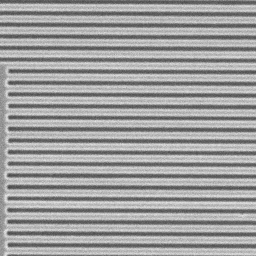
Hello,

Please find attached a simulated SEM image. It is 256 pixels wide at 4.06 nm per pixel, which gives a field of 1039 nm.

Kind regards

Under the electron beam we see parallel lines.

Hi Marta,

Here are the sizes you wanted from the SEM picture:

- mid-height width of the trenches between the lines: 22.3 nm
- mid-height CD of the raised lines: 0.0264 um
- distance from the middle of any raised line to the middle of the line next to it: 47.1 nm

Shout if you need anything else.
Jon